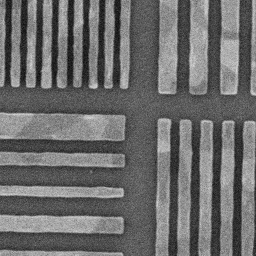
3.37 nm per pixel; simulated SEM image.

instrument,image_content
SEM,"groups of lines, slits or small figures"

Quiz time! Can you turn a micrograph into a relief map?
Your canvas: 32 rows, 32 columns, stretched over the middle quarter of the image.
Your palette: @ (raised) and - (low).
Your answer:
---@--@@---@--@@--------@@@@----
---@--@@--@@--@@--------@@@@----
---@--@@--@@--@@--------@@@@----
---@--@@--@@--@@--------@@@@----
---@--@@--@@--@@--------@@@@----
---@--@@--@@--@@--------@@@@----
------------------------@@@@----
--------------------------------
--------------------------------
--------------------------------
--------------------------------
--------------------------------
--------------------------------
@@@@@@@@@@@@@@@-----------------
@@@@@@@@@@@@@@@---------@@@--@@@
@@@@@@@@@@@@@@@---------@@@--@@@
@@@@@@@@@@@@@@@---------@@---@@@
@@@@@@@@@@@@@@@---------@@---@@@
@@@@@@@@@@@@@@@---------@@---@@@
------------------------@@---@@@
------------------------@@---@@@
------------------------@@---@@@
@-@@@@@@@@@-------------@@---@@@
@@@@@@@@@@@@@@@---------@@---@@@
@@@@@@@@@@@@@@@---------@@---@@@
---------@@@@@@---------@@---@@@
------------------------@@---@@@
------------------------@@---@@@
------------------------@@---@@@
------------------------@@---@@@
------------------------@@---@@-
@@@@@@@@@@@@@@@---------@@---@@-